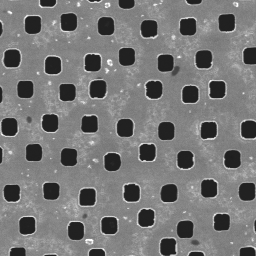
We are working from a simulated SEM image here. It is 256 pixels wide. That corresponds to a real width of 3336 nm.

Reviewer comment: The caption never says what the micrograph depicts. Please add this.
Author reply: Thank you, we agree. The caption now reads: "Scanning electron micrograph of a regular array of holes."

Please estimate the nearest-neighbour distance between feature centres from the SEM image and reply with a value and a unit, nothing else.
0.441 microns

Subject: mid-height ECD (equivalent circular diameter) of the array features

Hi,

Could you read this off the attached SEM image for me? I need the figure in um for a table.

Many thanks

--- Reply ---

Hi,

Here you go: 0.236